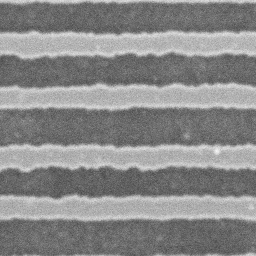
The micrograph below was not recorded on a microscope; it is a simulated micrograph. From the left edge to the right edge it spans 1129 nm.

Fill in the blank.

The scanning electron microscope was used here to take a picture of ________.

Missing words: lines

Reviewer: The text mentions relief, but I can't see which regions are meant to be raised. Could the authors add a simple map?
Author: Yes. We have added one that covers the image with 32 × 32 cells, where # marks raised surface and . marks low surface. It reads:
................................
................................
................................
................................
################################
################################
#####################.##########
................................
................................
................................
................................
################################
################################
####.#.#..######........##...###
................................
................................
................................
................................
################################
################################
################################
................................
................................
................................
.........#.............#........
################################
################################
..........#.....................
................................
................................
................................
................................